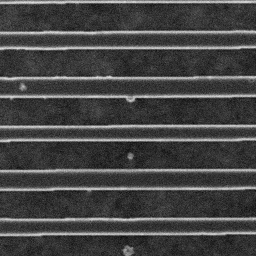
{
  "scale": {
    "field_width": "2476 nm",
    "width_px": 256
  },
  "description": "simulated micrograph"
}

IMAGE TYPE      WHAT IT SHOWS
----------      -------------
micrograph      lines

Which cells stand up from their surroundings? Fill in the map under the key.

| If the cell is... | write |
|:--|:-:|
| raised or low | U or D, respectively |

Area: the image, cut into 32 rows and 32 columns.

DDDDDDDDDDDDDDDDDDDDDDDDDDDDDDDD
DDDDDDDDDDDDDDDDDDDDDDDDDDDDDDDD
DDDDDDDDDDDDDDDDDDDDDDDDDDDDDDDD
DDDDDDDDDDDDDDDDDDDDDDDDDDDDDDDD
UUUUUUUUUUUUUUUUUUUUUUUUUUUUUUUU
UUUUUUUUUUUUUUUUUUUUUUUUUUUUUUUU
DDDDDDDDDDDDDDDDDDDDDDDDDDDDDDDD
DDDDDDDDDDDDDDDDDDDDDDDDDDDDDDDD
DDDDDDDDDDDDDDDDDDDDDDDDDDDDDDDD
DDDDDDDDDDDDDDDDDDDDDDDDDDDDDDDD
UUUUUUUUUUUUUUUUUUUUUUUUUUUUUUUU
UUUUUUUUUUUUUUUUUUUUUUUUUUUUUUUU
DDDDDDDDDDDDDDDDDDDDDDDDDDDDDDDD
DDDDDDDDDDDDDDDDDDDDDDDDDDDDDDDD
DDDDDDDDDDDDDDDDDDDDDDDDDDDDDDDD
DDDDDDDDDDDDDDDDDDDDDDDDDDDDDDDD
UUUUUUUUUUUUUUUUUUUUUUUUUUUUUUUU
UUUUUUUUUUUUUUUUUUUUUUUUUUUUUUDD
DDDDDDDDDDDDDDDDDDDDDDDDDDDDDDDD
DDDDDDDDDDDDDDDDDDDDDDDDDDDDDDDD
DDDDDDDDDDDDDDDDDDDDDDDDDDDDDDDD
UUUUUUUUUUUUUUUUUUUUUUUUUUUUUUUU
UUUUUUUUUUUUUUUUUUUUUUUUUUUUUUUU
UUUUUUUUUUUUUUUUUUUUUUUUUUUUUUUU
DDDDDDDDDDDDDDDDDDDDDDDDDDDDDDDD
DDDDDDDDDDDDDDDDDDDDDDDDDDDDDDDD
DDDDDDDDDDDDDDDDDDDDDDDDDDDDDDDD
UUUUUUUUUUUUUUUUUUUUUUUUUUUUUUUU
UUUUUUUUUUUUUUUUUUUUUUUUUUUUUUUU
DDDDDDDDDDDDDDDDDDDDDDDDDDDDDDDD
DDDDDDDDDDDDDDDDDDDDDDDDDDDDDDDD
DDDDDDDDDDDDDDDDDDDDDDDDDDDDDDDD